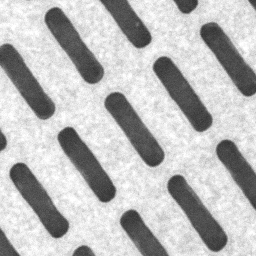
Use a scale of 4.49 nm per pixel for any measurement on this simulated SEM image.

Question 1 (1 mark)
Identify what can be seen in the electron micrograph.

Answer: holes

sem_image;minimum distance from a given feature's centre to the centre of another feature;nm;268